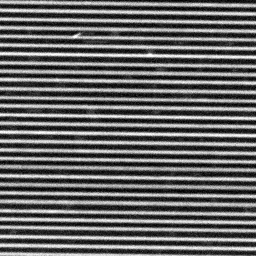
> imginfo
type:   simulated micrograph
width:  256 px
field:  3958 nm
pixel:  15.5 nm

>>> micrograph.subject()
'parallel lines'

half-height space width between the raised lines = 0.102 µm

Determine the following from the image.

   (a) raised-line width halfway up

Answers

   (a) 30.9 nm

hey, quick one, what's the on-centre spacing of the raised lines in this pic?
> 134 nanometers